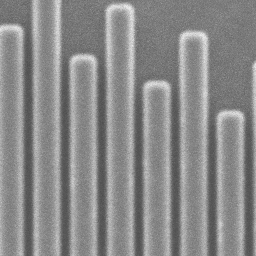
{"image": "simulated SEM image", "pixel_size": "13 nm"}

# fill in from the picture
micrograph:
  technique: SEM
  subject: parallel lines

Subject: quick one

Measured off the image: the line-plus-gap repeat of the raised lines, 478 nanometres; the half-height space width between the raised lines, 143 nm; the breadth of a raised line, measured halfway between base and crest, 335 nm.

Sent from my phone